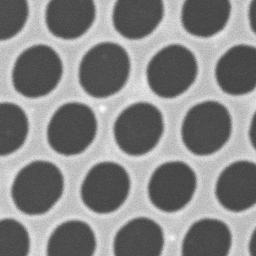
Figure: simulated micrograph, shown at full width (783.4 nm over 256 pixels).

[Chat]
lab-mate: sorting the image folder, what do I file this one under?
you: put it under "a regular array of holes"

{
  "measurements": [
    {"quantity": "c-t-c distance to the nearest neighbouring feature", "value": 204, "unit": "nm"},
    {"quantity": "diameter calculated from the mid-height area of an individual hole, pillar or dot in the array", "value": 0.162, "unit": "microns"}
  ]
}